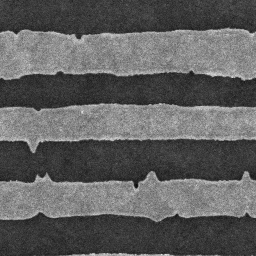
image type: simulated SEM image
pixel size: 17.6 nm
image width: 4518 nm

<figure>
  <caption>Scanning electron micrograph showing one or a few lines or trenches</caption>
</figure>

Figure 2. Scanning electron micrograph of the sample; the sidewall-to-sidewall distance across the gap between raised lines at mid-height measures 682 nm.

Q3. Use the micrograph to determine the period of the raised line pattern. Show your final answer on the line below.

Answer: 1280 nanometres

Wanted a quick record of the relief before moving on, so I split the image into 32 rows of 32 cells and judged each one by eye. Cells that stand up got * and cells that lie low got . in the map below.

................................
................................
................................
................................
*********..*********************
********************************
********************************
********************************
********************************
***..........................***
................................
................................
................................
..*.....***************..***..**
********************************
********************************
********************************
******..........................
................................
................................
................................
................................
.....*............**..***.....**
********************************
********************************
********************************
********************************
...................*............
................................
................................
................................
................................